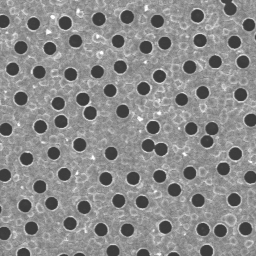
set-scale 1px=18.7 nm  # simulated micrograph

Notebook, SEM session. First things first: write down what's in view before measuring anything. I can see a regular array of holes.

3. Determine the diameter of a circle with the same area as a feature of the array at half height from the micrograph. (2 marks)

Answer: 250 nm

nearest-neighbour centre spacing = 434 nanometers